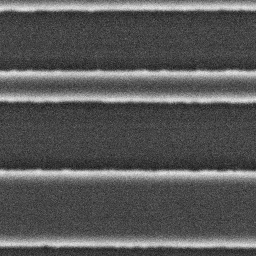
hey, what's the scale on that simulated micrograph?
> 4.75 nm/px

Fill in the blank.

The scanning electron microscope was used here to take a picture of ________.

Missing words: lines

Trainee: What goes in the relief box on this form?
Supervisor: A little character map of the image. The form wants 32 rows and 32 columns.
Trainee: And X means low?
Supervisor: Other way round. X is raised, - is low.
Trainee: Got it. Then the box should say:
XXXXXXXXXXXXXXXXXXXXXXXXXXXXXXXX
--------------------------------
--------------------------------
--------------------------------
--------------------------------
--------------------------------
--------------------------------
--------------------------------
--------------------------------
XXXXXXXXXXXXXXXXXXXXXXXXXXXXXXXX
XXXXXXXXXXXXXXXXXXXXXXXXXXXXXXXX
XXXXXXXXXXXXXXXXXXXXXXXXXXXXXXXX
XXXXXXXXXXXXXXXXXXXXXXXXXXXXXXXX
--------------------------------
--------------------------------
--------------------------------
--------------------------------
--------------------------------
--------------------------------
--------------------------------
--------------------------------
XXXXXXXXXXXXXXXXXXXXXXXX-XX-XXXX
XXXXXXXXXXXXXXXXXXXXXXXXXXXXXXXX
XXXXXXXXXXXXXXXXXXXXXXXXXXXXXXXX
XXXXXXXXXXXXXXXXXXXXXXXXXXXXXXXX
XXXXXXXXXXXXXXXXXXXXXXXXXXXXXXXX
XXXXXXXXXXXXXXXXXXXXXXXXXXXXXXXX
XXXXXXXXXXXXXXXXXXXXXXXXXXXXXXXX
XXXXXXXXXXXXXXXXXXXXXXXXXXXXXXXX
XXXXXXXXXXXXXXXXXXXXXXXXXXXXXXXX
XXXXXXXXXXXXXXXXXXXXXXXXXXXXXXXX
--------------------------------